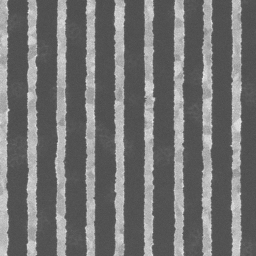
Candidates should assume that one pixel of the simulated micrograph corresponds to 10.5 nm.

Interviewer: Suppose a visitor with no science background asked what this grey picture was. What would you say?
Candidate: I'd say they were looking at parallel lines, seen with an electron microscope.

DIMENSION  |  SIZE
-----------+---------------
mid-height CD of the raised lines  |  85.1 nanometers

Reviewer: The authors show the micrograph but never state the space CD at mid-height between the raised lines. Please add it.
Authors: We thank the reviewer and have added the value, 221 nm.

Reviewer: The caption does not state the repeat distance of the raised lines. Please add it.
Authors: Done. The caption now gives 29.2 pixels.